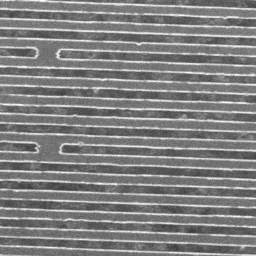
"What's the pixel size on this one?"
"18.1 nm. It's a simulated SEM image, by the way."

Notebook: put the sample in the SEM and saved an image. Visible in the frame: parallel lines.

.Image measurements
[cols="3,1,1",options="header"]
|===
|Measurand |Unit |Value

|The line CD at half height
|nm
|174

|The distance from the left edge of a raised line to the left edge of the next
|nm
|342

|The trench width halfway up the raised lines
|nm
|174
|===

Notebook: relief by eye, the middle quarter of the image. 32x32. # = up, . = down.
################################
................################
................................
................................
##########################......
################################
....................############
................................
#####...........................
##############################..
...#############################
..............................##
................................
#############...................
################################
........########################
................................
................................
######################..........
################################
.................###############
................................
................................
###########################.....
################################
.........................#######
................................
##########......................
################################
...#############################
................................
................................